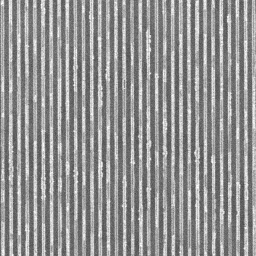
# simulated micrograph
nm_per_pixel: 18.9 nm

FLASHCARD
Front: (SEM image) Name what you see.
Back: parallel lines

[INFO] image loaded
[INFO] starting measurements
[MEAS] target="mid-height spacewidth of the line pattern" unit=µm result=0.111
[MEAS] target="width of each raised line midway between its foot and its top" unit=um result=0.0474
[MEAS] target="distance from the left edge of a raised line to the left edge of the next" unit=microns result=0.154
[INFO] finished